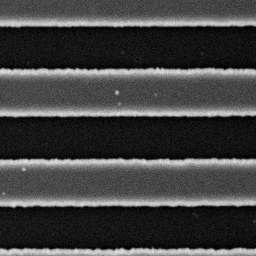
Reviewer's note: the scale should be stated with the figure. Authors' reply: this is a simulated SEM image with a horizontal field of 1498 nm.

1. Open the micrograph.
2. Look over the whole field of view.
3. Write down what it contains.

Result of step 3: lines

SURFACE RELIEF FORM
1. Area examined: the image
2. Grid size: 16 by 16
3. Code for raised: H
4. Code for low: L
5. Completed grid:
HHHHHHHHHHHHHHHH
HHHHHHHHHHHHHHHH
LLLLLLLLLLLLLLLL
LLLLLLLLLLLLLLLL
HHHHHHHHHHHHHHHH
HHHHHHHHHHHHHHHH
HHHHHHHHHHHHHHHH
LLLLLLLLLLLLLLLL
LLLLLLLLLLLLLLLL
LLLLLLLLLLLLLLLL
HHHHHHHHHHHHHHHH
HHHHHHHHHHHHHHHH
HHHHHHHHHHHHHHHH
LLLLLLLLLLLLLLLL
LLLLLLLLLLLLLLLL
LLLLLLLLLLLLLLLL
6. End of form